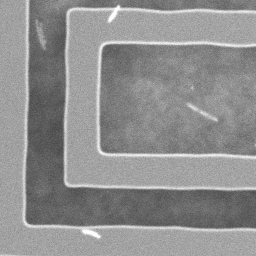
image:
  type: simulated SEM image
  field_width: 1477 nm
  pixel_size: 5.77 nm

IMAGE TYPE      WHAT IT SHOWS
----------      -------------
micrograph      groups of lines, slits or small figures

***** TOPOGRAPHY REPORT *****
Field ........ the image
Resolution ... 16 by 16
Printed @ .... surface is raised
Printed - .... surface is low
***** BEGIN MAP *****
@@--------------
@@--@@@@@@@@@@@@
@@--@@@@@@@@@@@@
@@--@@----------
@@--@@----------
@@--@@----------
@@--@@----------
@@--@@----------
@@--@@----------
@@--@@@---------
@@--@@@@@@@@@@@@
@@--@@@@@@@@@@@@
@@--------------
@@--------------
@@@@@@@@@@@@@@@@
@@@@@@@@@@@@@@@@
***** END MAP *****